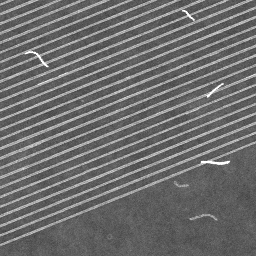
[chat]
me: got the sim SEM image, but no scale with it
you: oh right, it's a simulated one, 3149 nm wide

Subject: parallel lines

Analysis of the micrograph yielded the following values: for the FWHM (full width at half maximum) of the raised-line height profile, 25.6 nm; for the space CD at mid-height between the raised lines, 6.85 px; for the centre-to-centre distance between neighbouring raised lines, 110 nm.